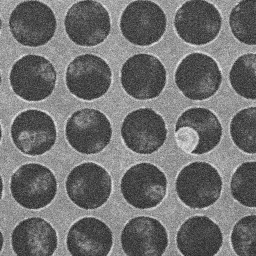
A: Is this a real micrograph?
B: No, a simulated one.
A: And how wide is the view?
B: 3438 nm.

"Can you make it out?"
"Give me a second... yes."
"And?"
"a regular array of holes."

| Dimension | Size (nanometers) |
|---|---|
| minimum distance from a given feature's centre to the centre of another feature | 727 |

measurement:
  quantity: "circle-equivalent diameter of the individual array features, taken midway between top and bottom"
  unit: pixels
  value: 47.4